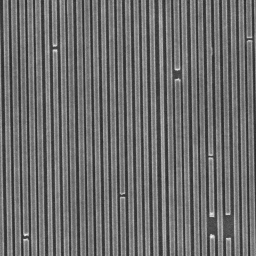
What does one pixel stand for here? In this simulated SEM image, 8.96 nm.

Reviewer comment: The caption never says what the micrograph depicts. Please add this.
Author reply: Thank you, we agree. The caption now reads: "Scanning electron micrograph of parallel lines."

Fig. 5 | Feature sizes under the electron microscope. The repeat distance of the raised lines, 72.6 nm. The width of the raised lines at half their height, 45.9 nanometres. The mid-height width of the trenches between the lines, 0.0302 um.